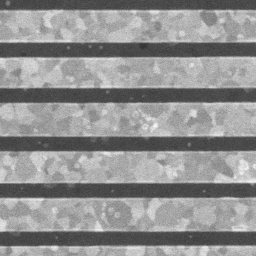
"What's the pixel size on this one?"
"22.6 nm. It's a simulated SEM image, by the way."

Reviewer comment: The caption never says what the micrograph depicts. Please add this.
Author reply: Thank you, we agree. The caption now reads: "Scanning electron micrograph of lines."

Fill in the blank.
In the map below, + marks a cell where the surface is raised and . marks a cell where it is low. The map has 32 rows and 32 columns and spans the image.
................................
++++++++++++++++++++++++++++++++
++++++++++++++++++++++++++++++++
++++++++++++++++++++++++++++++++
++++++++++++++++++++++++++++++++
................................
................................
++++++++++++++++++++++++++++++++
++++++++++++++++++++++++++++++++
++++++++++++++++++++++++++++++++
++++++++++++++++++++++++++++++++
................................
................................
++++++++++++++++++++++++++++++++
++++++++++++++++++++++++++++++++
++++++++++++++++++++++++++++++++
++++++++++++++++++++++++++++++++
................................
................................
++++++++++++++++++++++++++++++++
++++++++++++++++++++++++++++++++
++++++++++++++++++++++++++++++++
++++++++++++++++++++++++++++++++
................................
................................
++++++++++++++++++++++++++++++++
++++++++++++++++++++++++++++++++
++++++++++++++++++++++++++++++++
++++++++++++++++++++++++++++++++
................................
................................
++++++++++++++++++++++++++++++++